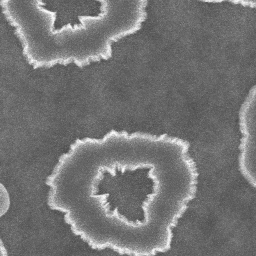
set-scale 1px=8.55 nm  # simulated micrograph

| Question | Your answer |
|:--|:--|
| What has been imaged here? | ring-shaped raised bodies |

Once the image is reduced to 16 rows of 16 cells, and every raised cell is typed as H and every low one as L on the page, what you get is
HHHLLLHHHLLLLLLL
LHHLLHHHHLLLLLLL
LHHHHHHLLLLLLLLL
LLHHHHHLLLLLLLLL
LLLLLLLLLLLLLLLL
LLLLLLLLLLLLLLLL
LLLLLLLLLLLLLLLH
LLLLLLLLLLLLLLLH
LLLLLLLHHLLLLLLH
LLLLHHHHHHHHLLLH
LLLLHHHHHHHHLLLH
LLLHHHLLLLHHLLLL
LLLHHHLLLHHHLLLL
LLLLHHHHLHHLLLLL
LLLLLHHHHHHLLLLL
LLLLLLLHHHLLLLLL